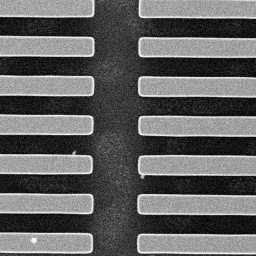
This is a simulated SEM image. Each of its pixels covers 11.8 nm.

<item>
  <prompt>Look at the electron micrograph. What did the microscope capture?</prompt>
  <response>groups of lines, slits or small figures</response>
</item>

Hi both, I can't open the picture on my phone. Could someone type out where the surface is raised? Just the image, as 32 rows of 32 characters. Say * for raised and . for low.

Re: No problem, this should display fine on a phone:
************.....***************
************.....***************
................................
................................
................................
************.....***************
************.....***************
................................
................................
***.****........................
************.....***************
************.....***************
................................
................................
***********.....................
************.....***************
***********......***************
................................
................................
**********...........**.........
***********......***************
***********......***************
................................
................................
***********......***************
************.....***************
***********......***************
................................
................................
***********......***************
***********......***************
***********.......**************